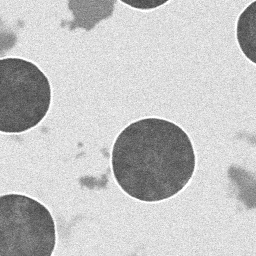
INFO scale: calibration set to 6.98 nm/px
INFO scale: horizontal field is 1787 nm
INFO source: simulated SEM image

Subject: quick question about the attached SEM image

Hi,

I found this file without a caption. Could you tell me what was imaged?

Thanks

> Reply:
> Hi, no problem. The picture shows holes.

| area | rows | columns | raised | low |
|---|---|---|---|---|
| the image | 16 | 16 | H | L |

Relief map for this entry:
HHHHHHHHHHHHHHHL
HHHHHHHHHHHHHHHL
HHHHHHHHHHHHHHHL
HHHHHHHHHHHHHHHL
LLLHHHHHHHHHHHHH
LLLHHHHHHHHHHHHH
LLLHHHHHHHHHHHHH
LLLHHHHHHLHHHHHH
HHHHHHHLLLLLHHHH
HHHHHHHLLLLLHHHH
HHHHHHHLLLLLHHHH
HHHHHHHLLLLLHHHH
LLHHHHHHHLHHHHHH
LLLHHHHHHHHHHHHH
LLLHHHHHHHHHHHHH
LLLHHHHHHHHHHHHH